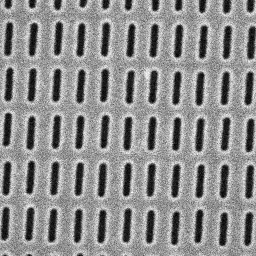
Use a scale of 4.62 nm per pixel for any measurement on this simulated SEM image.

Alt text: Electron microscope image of a regular array of holes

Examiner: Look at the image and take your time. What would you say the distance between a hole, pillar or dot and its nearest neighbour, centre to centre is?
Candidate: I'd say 23.8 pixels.